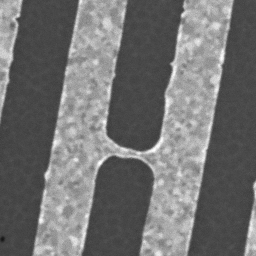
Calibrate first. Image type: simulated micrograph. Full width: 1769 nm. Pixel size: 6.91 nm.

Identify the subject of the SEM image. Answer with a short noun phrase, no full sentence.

one or a few lines or trenches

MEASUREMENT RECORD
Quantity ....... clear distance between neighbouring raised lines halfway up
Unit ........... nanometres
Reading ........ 392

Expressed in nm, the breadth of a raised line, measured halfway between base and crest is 334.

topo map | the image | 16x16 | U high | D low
UDDDDUUUDDDUUUDD
UDDDDUUUDDDUUUDD
UDDDDUUUDDDUUUDD
UDDDUUUDDDDUUUDD
UDDDUUUDDDDUUUDD
DDDDUUUDDDUUUUDD
DDDDUUUDDDUUUDDD
DDDDUUUDDDUUUDDD
DDDUUUUDDDUUUDDD
DDDUUUUUDUUUUDDD
DDDUUUDDDUUUUDDD
DDDUUUDDDDUUUDDD
DDDUUUDDDUUUDDDD
DDDUUUDDDUUUDDDD
DDUUUDDDDUUUDDDD
DDUUUDDDDUUUDDDU